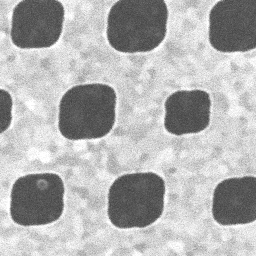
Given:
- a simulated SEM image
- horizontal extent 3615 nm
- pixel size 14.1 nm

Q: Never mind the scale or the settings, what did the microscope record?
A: holes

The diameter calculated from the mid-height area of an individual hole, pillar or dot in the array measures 0.831 µm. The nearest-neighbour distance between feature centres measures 1400 nanometers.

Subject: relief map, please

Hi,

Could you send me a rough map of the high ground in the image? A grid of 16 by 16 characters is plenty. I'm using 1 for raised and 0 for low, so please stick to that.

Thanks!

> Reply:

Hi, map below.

1000111000111000
1000111000111000
1000111000111000
1111111111111111
1111111111111111
1111000111111111
0111000111000111
0111000111000111
1111000111111111
1111111111111111
1111111111111111
1000111000111100
1000111000111000
1000111000111000
1111111111111111
1111111111111111